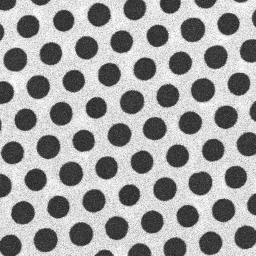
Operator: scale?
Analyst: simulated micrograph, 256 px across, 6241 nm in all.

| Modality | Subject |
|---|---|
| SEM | a regular array of holes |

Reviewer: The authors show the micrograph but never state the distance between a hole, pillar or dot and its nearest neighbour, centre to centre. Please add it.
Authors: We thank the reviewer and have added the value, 859 nanometers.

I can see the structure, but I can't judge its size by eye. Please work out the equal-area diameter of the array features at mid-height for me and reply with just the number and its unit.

570 nm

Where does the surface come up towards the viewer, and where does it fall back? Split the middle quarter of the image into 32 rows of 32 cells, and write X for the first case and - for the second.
XXXXXXXXX----XXXX------XXX------
XX-XXXXXX-----XXX------XXXX----X
-----XXX------XXXX-----XXXXX--XX
-----XXX------XXXX----XXXXXXXXXX
-----XXXX-----XXXXXXXXXXXXXXXXXX
-----XXXXX--XXXXXXXXXXXX----XXXX
X---XXXXXXXXXXXXXXXXXXX-----XXXX
XXXXXXXXXXXXXXX----XXXX------XXX
XXXXXXX--XXXXX------XXX------XXX
XXXXXX----XXXX------XXX-----XXXX
--XXX------XXX------XXXX---XXXXX
--XXX------XXXX----XXXXXXXXXXXXX
--XXXX----XXXXXX--XXXXXXXXXXXX--
--XXXXX--XXXXXXXXXXXXX--XXXXX---
-XXXXXXXXXXXXXXXXXXX-----XXXX---
XXXXXXXXXXXX----XXXX------XXX---
XXXX--XXXXX------XXX------XXX---
XXX----XXXX------XXX-----XXXXX--
XX------XXX------XXXX----XXXXXXX
XX------XXX-----XXXXXXXXXXXXXXXX
XX------XXXXX--XXXXXXXXXXXX---XX
XXX----XXXXXXXXXXXXXXXXXXX-----X
XXXXXXXXXXXXXXXXXX---XXXXX-----X
XXXXXXXXX---XXXXX-----XXX------X
X--XXXXX-----XXXX-----XXXX-----X
----XXXX------XXX-----XXXXX---XX
-----XXX-----XXXX-----XXXXXXXXXX
-----XXX-----XXXXXXXXXXXXXXXXXXX
-----XXXX---XXXXXXXXXXXX---XXXX-
----XXXXXXXXXXXXXXXXXXX-----XXX-
X--XXXXXXXXXXXX---XXXX------XXX-
XXXXXXX--XXXXX-----XXX------XXXX